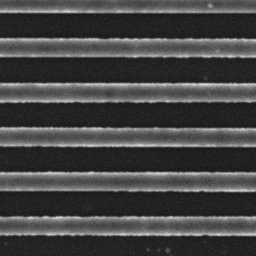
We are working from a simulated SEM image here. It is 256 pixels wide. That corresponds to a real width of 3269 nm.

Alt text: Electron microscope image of lines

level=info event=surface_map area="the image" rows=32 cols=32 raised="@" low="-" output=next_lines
@@@@@@@@@@@@@@@@@@@@@@@@@@@@@@@@
@@@@@@@@@@@@@@@@@@@@@@@@@@@@@@@@
--------------------------------
--------------------------------
--------------------------------
@@@@@@@@@@@@@@@@@@@@@@@@@@@@@@@@
@@@@@@@@@@@@@@@@@@@@@@@@@@@@@@@@
--------------------------------
--------------------------------
--------------------------------
@@@@@@@@@@@@@@@@@@@@@@@@@@@@@@@@
@@@@@@@@@@@@@@@@@@@@@@@@@@@@@@@@
@@@@@@@@@@@@@@@@@@@@@@@@@@@@@@@@
--------------------------------
--------------------------------
--------------------------------
@@@@@@@@@@@@@@@@@@@@@@@@@@@@@@@@
@@@@@@@@@@@@@@@@@@@@@@@@@@@@@@@@
--------------------------------
--------------------------------
--------------------------------
------@----@--------------------
@@@@@@@@@@@@@@@@@@@@@@@@@@@@@@@@
@@@@@@@@@@@@@@@@@@@@@@@@@@@@@@@@
--------------------------------
--------------------------------
--------------------------------
@@@@@@@@@@@@@@@@@@@@@@@@@@@@@@@@
@@@@@@@@@@@@@@@@@@@@@@@@@@@@@@@@
--------------------------------
--------------------------------
--------------------------------